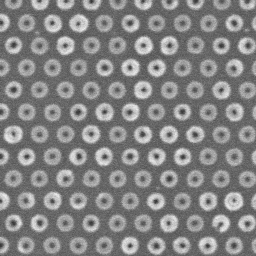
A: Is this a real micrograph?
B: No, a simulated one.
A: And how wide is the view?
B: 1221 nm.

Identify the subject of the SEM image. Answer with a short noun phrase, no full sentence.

a regular array of ring-shaped raised bodies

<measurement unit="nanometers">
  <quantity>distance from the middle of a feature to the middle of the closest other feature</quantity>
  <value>121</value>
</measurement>